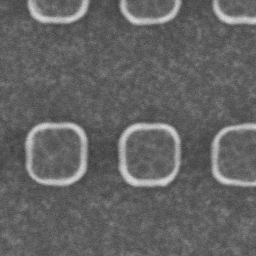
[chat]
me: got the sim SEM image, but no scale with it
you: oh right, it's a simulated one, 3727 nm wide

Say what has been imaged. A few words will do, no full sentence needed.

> raised bodies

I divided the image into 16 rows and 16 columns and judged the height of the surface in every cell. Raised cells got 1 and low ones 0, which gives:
0011100011100011
0000000000000000
0000000000000000
0000000000000000
0000000000000000
0000000000000000
0000000000000000
0000000000000000
0011100011100011
0011100011100111
0011100011100111
0000000000000001
0000000000000000
0000000000000000
0000000000000000
0000000000000000